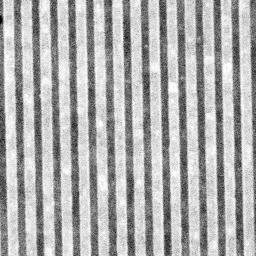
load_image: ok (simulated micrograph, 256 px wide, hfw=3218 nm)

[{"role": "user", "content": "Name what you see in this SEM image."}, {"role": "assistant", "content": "parallel lines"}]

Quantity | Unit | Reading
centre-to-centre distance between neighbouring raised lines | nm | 228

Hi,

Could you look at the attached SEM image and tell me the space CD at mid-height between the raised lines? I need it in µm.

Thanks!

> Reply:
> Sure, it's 0.113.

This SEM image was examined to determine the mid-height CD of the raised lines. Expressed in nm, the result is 112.